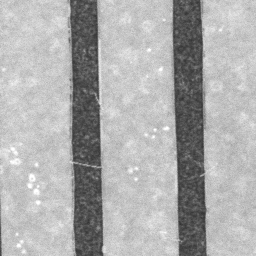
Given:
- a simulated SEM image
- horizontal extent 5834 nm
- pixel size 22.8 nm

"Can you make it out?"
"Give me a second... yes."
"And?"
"one or a few lines or trenches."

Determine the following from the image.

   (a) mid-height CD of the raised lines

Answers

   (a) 678 nm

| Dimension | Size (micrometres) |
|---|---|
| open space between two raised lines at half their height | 1.67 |